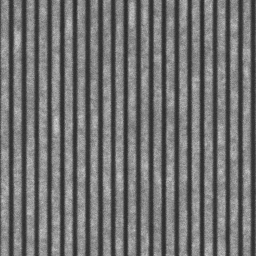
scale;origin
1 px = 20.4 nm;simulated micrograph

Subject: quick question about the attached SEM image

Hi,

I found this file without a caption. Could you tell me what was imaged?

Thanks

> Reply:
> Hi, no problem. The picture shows parallel lines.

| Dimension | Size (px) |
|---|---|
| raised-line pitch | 12.7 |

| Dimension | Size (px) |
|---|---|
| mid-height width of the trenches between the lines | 4.5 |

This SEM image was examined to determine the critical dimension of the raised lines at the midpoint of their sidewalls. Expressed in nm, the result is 163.